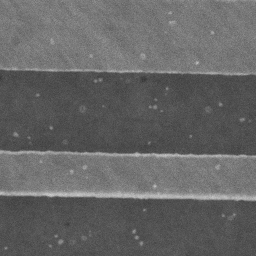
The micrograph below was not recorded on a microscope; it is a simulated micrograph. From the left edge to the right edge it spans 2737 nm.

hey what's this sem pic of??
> lines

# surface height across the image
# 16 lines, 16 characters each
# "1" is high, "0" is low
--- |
1111111111111111
1111111111111111
1111111111111111
1111111111111111
0000000101111111
0000000000000000
0000000000000000
0000000000000000
0000000000000000
1111000000000000
1111111111111111
1111111111111111
0000000000000001
0000000000000000
0000000000000000
0000000000000000